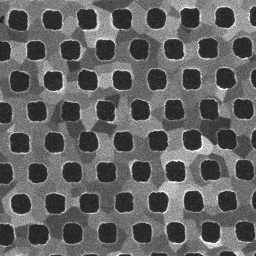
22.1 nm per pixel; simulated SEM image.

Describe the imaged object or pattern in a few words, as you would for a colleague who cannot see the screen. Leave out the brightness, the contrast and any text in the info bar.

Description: a regular array of holes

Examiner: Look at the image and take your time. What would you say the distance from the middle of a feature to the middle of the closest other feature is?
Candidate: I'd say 0.757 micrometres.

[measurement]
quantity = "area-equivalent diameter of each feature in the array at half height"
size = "473 nanometres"